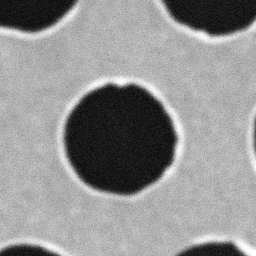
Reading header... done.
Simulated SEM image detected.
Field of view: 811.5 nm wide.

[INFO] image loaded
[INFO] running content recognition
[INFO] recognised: holes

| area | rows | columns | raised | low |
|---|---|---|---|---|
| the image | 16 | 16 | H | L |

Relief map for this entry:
LLLLLHHHHHLLLLLL
LLLLHHHHHHHLLLLL
HHHHHHHHHHHHHHHH
HHHHHHHHHHHHHHHH
HHHHHHHHHHHHHHHH
HHHHHHLLLHHHHHHH
HHHHHLLLLLHHHHHH
HHHHLLLLLLLHHHHH
HHHHLLLLLLLHHHHH
HHHHLLLLLLLHHHHH
HHHHLLLLLLLHHHHH
HHHHHLLLLLHHHHHH
HHHHHHHHHHHHHHHH
HHHHHHHHHHHHHHHH
HHHHHHHHHHHHHHHH
LLLHHHHHHHHHLLLH